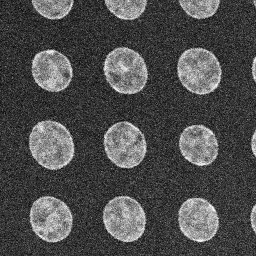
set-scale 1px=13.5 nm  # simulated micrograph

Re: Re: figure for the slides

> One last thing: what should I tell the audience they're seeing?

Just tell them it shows a regular array of raised bodies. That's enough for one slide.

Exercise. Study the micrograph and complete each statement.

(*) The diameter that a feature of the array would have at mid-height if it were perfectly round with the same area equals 575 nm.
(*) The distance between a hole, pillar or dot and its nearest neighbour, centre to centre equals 73.6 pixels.